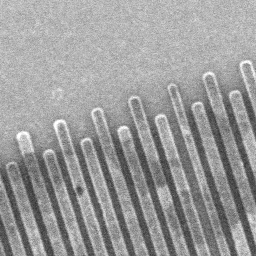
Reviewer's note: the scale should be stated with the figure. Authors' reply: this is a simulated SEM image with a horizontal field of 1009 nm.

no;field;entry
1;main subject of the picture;parallel lines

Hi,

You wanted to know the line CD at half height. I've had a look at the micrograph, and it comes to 41.3 nanometers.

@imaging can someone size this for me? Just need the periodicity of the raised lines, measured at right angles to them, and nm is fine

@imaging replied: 76.8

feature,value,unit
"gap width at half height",34.3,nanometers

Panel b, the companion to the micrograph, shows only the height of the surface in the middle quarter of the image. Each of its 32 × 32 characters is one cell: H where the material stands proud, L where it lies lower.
LLLLLLLLLLLLLLLLLLLLLLLLLLLLLLLL
LLLLLLLLLLLLLLLLLLLLLLLLLLLLLLLL
LLLLLLLLLLLLLLLLLLLLLLLLLLLLLLLL
LLLLLLLLLLLLLLLLLLLLLLLLLLLLLLLL
LLLLLLLLLLLLLLLLLLLLLLLLLLLLLLLL
LLLLLLLLLLLLLLLLLLLLLLLLLLHHLLLL
LLLLLLLLLLLLLLLLLLLLLLLLLLHHLLLL
LLLLLLLLLLLLLLLLLLLLLLLLLLHHHLLL
LLLLLLLLLLLLLLLLLHLLLLLLLLLHHLLL
LLLLLLLLLLLLLLLLHHHLLLLLLLLHHLLL
LLLLLLLLLLLLLLLLLHHLLLLLLLLLHLLL
LLLLLLLLHLLLLLLLLHHHLLLLLLLLHHLL
LLLLLLLHHHLLLLLLLHHHLLLLLLLLHHLL
LLLLLLLHHHLLLLLLLHHHLLLHHLLLHHLL
LLLLLLLLHHLLLLLLLLHHHLLHHHLLLHHL
LLLLLLLLHHHLLLLLLLHHHLLHHHLLLHHL
HLLLLLLLHHHLLLHHLLHHHLLLHHLLLHHL
HLLLLLLLLHHLLLHHLLLHHHLLHHHLLLHH
HLLLLLLLLHHHLLHHHLLHHHLLHHHLLLHH
HHLLLHHLLHHHLLHHHLLLHHLLLHHLLLLH
HHLLLHHLLLHHLLLHHLLLHHHLLHHHLLLH
HHLLLHHLLLHHHLLHHHLLHHHLLHHHLLLH
HHHLLHHHLLHHHLLHHHLLHHHLLLHHLLLH
HHHLLLHHLLLHHLLLHHLLLHHHLLHHHLLL
LHHLLLHHLLLHHHLLHHHLLHHHLLHHHLLL
LHHHLLHHHLLHHHLLHHHLLHHHLLLHHLLL
LHHHLLHHHLLLHHLLLHHLLLHHHLLHHHLL
LLHHLLLHHHLLHHHLLHHHLLHHHLLHHHLL
LLHHHLLHHHLLHHHLLHHHLLHHHLLHHHLL
LLHHHLLHHHLLHHHLLHHHLLLHHLLLHHHL
LLLHHLLLHHLLLHHHLLHHHLLHHHLLHHHL
HLLHHHLLHHHLLHHHLLHHHLLHHHLLHHHL